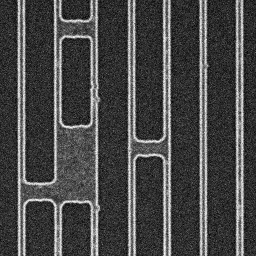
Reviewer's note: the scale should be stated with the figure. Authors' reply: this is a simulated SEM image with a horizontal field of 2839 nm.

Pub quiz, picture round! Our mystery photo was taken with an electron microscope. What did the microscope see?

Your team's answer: parallel lines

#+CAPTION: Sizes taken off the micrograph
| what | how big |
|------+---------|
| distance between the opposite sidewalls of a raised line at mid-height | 0.061 µm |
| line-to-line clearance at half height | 346 nm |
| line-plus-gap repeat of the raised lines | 403 nm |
